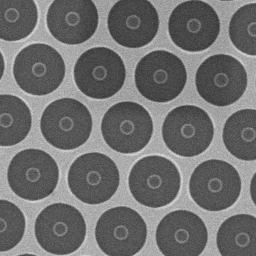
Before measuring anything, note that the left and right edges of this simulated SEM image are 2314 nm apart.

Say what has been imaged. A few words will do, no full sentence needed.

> an array of small figures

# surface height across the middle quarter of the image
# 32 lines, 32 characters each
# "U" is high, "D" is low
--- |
UUDDDDDDDDDDDDDUUUDDDDDDDDDDDDUU
UUDDDDDDUUDDDDDDUUDDDDDDDDDDDDDU
UUDDDDDUUUUDDDDDUDDDDDDUUUDDDDDU
UUDDDDDDUUDDDDDUUUDDDDUUUUDDDDDU
UUUDDDDDDDDDDDDUUUDDDDDUUDDDDDDU
UUUDDDDDDDDDDDDUUUDDDDDDDDDDDDUU
UUUUDDDDDDDDDDUUUUDDDDDDDDDDDDUU
UUUUUDDDDDDDDUUUUUUDDDDDDDDDDUUU
DDUUUUDDDDDUUUUUUUUUDDDDDDDDUUUU
DDDDUUUUUUUUUUDDDUUUUUDDDDUUUUUU
DDDDDUUUUUUUDDDDDDDDUUUUUUUUUDDD
DDDDDDUUUUUDDDDDDDDDDUUUUUUDDDDD
DDDDDDDUUUDDDDDDDDDDDDUUUUDDDDDD
UDDDDDDUUUDDDDDDDDDDDDUUUDDDDDDD
UUDDDDDUUDDDDDDUUDDDDDUUUDDDDDDD
UUDDDDDUUDDDDDUUUDDDDDUUDDDDDDUU
UDDDDDDUUDDDDDUUUDDDDDUUDDDDDDUU
DDDDDDDUUDDDDDDDDDDDDDUUDDDDDDUU
DDDDDDUUUUDDDDDDDDDDDDUUUDDDDDDD
DDDDDUUUUUDDDDDDDDDDDUUUUDDDDDDD
DDDDUUUUUUUDDDDDDDDDDUUUUUDDDDDD
DDUUUUUUUUUUDDDDDDDDUUUUUUDDDDDD
UUUUUDDDDDUUUUUDDDUUUUUUUUUUDDDD
UUUDDDDDDDDDUUUUUUUDDDDDDDUUUUUU
UUDDDDDDDDDDDUUUUUDDDDDDDDDUUUUU
UUDDDDDDDDDDDUUUUDDDDDDDDDDDUUUU
UDDDDDDDDDDDDDUUUDDDDDDDDDDDDUUU
UDDDDDUUUDDDDDUUDDDDDDDDDDDDDUUU
UDDDDDUUUDDDDDUUDDDDDUUUDDDDDUUU
UDDDDDUUUDDDDDUUDDDDDUUUDDDDDUUD
UDDDDDDDDDDDDDUUDDDDDUUUDDDDDUUD
UDDDDDDDDDDDDUUUDDDDDDDDDDDDDUUD